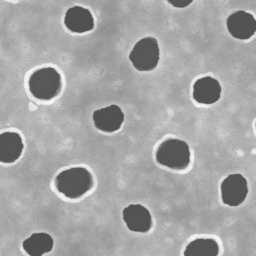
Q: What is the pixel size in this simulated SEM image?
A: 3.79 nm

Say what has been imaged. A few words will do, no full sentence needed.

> a regular array of holes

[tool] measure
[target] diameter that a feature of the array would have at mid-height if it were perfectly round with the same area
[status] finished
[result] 111 nanometers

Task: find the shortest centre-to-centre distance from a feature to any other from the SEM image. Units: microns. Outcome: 0.273